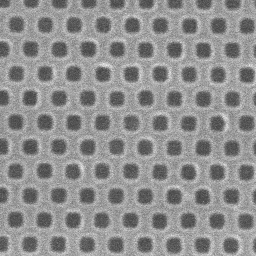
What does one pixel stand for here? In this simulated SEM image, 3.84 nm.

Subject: a regular array of holes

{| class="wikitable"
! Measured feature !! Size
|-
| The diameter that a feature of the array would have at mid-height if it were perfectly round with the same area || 69.1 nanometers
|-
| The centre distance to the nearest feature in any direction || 107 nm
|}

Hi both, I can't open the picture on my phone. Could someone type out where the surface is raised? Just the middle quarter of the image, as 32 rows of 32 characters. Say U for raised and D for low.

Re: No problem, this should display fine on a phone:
UDDDUUUUUUUUUUUUDUUUUUUDDUUUUUDD
DDDDUUUUDDDDUUUDDDDUUUDDDDUUUDDD
DDDDDUUDDDDDUUUDDDDUUUDDDDUUUDDD
DDDDDUUUDDDDUUUDDDDUUUDDDDUUUDDD
UDDDUUUUDDDUUUUDDDUUUUUDDUUUUUDD
UUUUUUUUUUUUUUUUUUUUUUUUUUUUUUUU
UUUUUDDUUUUUUUUUUUUDDDUUUUUDUUUU
DUUUDDDDUUUDDDDUUUDDDDDUUUDDDDUU
DUUUDDDDUUUDDDDUUUDDDDDUUUDDDDUU
DUUUDDDDUUUDDDDUUUDDDDDUUUDDDDUU
UUUUDDDUUUUUDDDUUUUDDDUUUUDDDUUU
UUUUUUUUUUUUUUUUUUUUUUUUUUUUUUUU
UUDUUUUUUDDUUUUUDDUUUUUUUUUUUUUU
DDDDUUUUDDDDUUUDDDDUUUDDDDUUUDDD
DDDDDUUDDDDDUUUDDDDUUUDDDDUUUDDD
DDDDDUUDDDDDUUUDDDDUUUDDDDUUUDDD
UDDDUUUUDDDUUUUDDDDUUUDDDDUUUDDD
UUUUUUUUUUUUUUUUUUUUUUUUUUUUUUUU
UUUUUUUUUUUUUUUUUUUUUUUUUUUUUUUU
DUUUDDDDUUUDDDDUUUDDDDUUUUDDDUUU
DUUUDDDDUUUDDDDUUUDDDDUUUDDDDDUU
DUUUDDDDUUUDDDDUUUDDDDUUUDDDDDUU
UUUUDDDDUUUUDDDUUUUDDDUUUDDDDUUU
UUUUUUUUUUUUUUUUUUUUUUUUUUUUUUUU
UUUUUUUUUUUUUUUUDUUUUUUUUUUUUUUU
DDDDUUUUDDDUUUUDDDDUUUDDDDUUUDDD
DDDDUUUDDDDDUUUDDDDUUUDDDDUUUDDD
DDDDUUUDDDDDUUUDDDDUUUDDDDUUUDDD
DDDDUUUUDDDUUUUDDDUUUUDDDDUUUDDD
UUUUUUUUUUUUUUUUUUUUUUUUUUUUUUUU
UUUUUUUUUUUUUUUUUUUUUUUUUUUUUUUU
DUUUDDDDUUUDDDDUUUDDDDUUUUDDDUUU